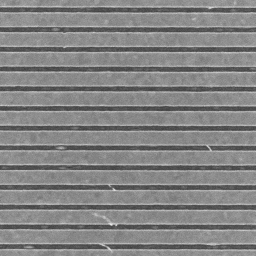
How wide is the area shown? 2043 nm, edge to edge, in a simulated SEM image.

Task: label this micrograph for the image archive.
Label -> parallel lines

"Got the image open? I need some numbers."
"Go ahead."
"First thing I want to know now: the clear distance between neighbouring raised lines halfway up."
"5.25 pixels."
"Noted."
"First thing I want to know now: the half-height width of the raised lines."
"116 nm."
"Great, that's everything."